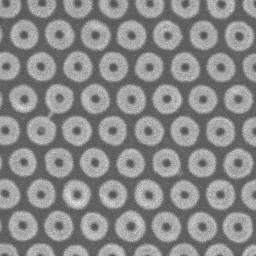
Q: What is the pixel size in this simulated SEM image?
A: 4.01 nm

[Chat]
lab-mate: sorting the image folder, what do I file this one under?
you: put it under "a regular array of ring-shaped raised bodies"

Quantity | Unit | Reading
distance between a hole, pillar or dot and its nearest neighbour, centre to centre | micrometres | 0.143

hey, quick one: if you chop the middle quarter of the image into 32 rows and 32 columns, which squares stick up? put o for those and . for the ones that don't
oo...oo..oo..ooo..oo..oo...oo..o
ooo.ooo..oo..ooo..ooo.oo...oo..o
ooooooo...ooooo...oooooo...ooooo
..oooo....oooo.....oooo.....oooo
................................
......ooo......ooo......ooo.....
oo...ooooo....ooooo....ooooo....
oo...oooooo...oooooo...oo.ooo...
oo..ooo..oo..ooo..oo..ooo..oo..o
oo...oo..oo..ooo..oo..ooo..oo..o
oo...oooooo...oooooo...oooooo...
o.....oooo.....oooo.....oooo....
................................
..oo.......ooo......oo.......oo.
oooooo...oooooo...oooooo....oooo
oooooo...oooooo...oooooo...ooooo
oo..ooo..oo..oo...oo..ooo..oo..o
oo..ooo..oo..oo...oo..ooo..oo..o
oooooo...oooooo...oooooo....oooo
.oooo......ooo.....ooooo....oooo
................................
......ooo.......oo.......oo.....
o....ooooo....ooooo....ooooo....
oo..ooooooo...oooooo...oooooo..o
oo..ooo..oo..ooo..oo..ooo..oo..o
oo..ooo.ooo..ooo..oo...oo..oo..o
oo...oooooo...oooooo...ooooo...o
o.....oooo.....oooo.....oooo....
................................
.ooo.......ooo......oo.......oo.
oooooo...oooooo....ooooo....oooo
oooooo...oooooo...oooooo...ooooo